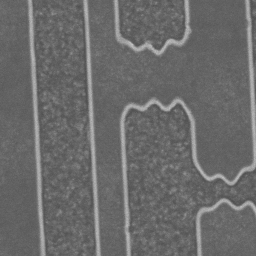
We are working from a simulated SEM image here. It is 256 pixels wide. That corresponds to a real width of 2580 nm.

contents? one or a few lines or trenches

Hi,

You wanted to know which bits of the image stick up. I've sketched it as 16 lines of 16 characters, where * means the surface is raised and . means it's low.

**...**.....***.
**...**.....****
**...***...*****
**....**********
**....**********
**....**********
**....***.******
**....**....****
**....**....****
**....**....****
**....**....****
**....**........
**....**........
***...**.....***
***...**....****
***...**....****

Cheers